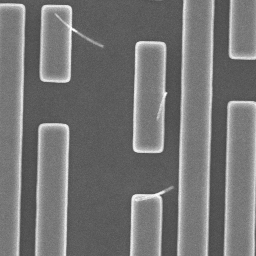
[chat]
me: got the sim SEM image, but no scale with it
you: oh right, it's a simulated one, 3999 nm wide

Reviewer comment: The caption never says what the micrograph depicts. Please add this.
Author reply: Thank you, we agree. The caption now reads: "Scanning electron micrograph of groups of lines, slits or small figures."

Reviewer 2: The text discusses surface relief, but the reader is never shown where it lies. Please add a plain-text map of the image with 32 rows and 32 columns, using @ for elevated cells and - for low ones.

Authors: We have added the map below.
-----------------------@@@@--@@@
@@@--@@@@--------------@@@@--@@@
@@@--@@@@--------------@@@@--@@@
@@@--@@@@--------------@@@@--@@@
@@@--@@@@--------------@@@---@@@
@@@--@@@@--------@@@---@@@---@@@
@@@--@@@@--------@@@@--@@@---@@@
@@@--@@@@--------@@@@--@@@------
@@@--@@@@--------@@@@--@@@------
@@@--@@@@--------@@@@--@@@------
@@@--------------@@@@--@@@------
@@@--------------@@@@--@@@------
@@@--------------@@@@--@@@------
@@@--------------@@@---@@@---@@@
@@@--------------@@@---@@@--@@@@
@@@--------------@@@---@@@--@@@@
@@@--@@@---------@@@---@@@--@@@@
@@@--@@@---------@@@---@@@--@@@@
@@@--@@@---------@@@---@@@--@@@@
@@@--@@@---------------@@@--@@@@
@@@--@@@--------------@@@@--@@@@
@@---@@@--------------@@@@--@@@@
@@---@@@--------------@@@@--@@@@
@@---@@@--------------@@@@--@@@@
@@---@@@---------@@@--@@@@--@@@@
@@---@@@---------@@@--@@@@--@@@@
@@---@@@--------@@@@--@@@@--@@@@
@@---@@@--------@@@@--@@@@--@@@@
@@---@@@--------@@@@--@@@@--@@@@
@@---@@@--------@@@@--@@@@--@@@@
@@--@@@@--------@@@@--@@@@--@@@@
@@--@@@@--------@@@@--@@@@--@@@@